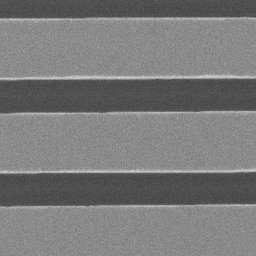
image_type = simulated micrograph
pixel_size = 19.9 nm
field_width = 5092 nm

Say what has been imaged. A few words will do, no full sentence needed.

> lines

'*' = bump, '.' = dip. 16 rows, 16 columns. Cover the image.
................
****************
****************
****************
****************
................
................
****************
****************
****************
****************
................
................
****************
****************
****************